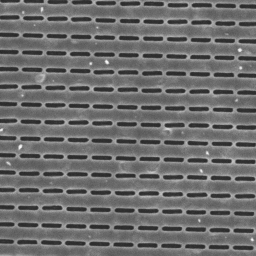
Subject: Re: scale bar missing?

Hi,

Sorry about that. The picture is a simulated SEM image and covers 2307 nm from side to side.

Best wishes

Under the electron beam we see a regular array of holes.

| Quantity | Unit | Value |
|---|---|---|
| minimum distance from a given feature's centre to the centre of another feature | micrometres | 0.154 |